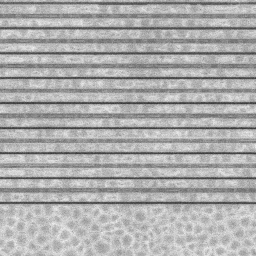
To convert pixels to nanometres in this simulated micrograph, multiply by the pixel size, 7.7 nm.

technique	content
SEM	parallel lines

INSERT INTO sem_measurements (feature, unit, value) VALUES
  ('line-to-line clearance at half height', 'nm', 22.1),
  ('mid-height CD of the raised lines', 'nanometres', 67.3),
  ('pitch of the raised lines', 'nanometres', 96.5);